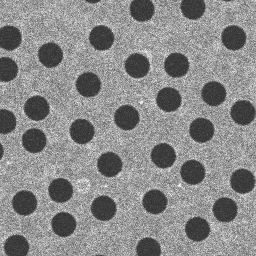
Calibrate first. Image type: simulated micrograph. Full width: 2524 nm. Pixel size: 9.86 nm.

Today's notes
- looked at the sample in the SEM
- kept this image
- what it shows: a regular array of holes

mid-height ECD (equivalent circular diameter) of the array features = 251 nanometres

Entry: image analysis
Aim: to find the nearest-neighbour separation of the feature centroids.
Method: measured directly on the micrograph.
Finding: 380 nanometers